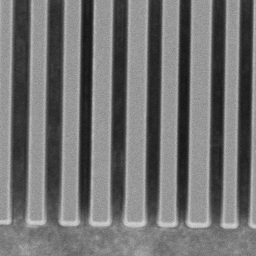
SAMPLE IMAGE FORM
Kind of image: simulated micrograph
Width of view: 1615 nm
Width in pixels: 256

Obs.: parallel lines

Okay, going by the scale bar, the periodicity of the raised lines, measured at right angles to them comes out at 204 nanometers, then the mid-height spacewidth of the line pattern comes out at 0.0781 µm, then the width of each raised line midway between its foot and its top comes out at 118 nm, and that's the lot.